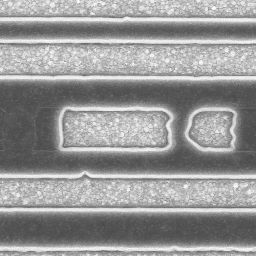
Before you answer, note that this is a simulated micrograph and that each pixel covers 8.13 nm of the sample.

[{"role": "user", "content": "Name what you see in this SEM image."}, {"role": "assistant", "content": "one or a few lines or trenches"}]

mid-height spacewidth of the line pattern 287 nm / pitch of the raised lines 540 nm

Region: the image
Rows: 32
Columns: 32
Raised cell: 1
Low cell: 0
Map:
00000000000000000000000000000000
00000000000000000000000000000000
11111111111111111111111111111100
11111111111111111111111111111111
11111111111111111111111111111111
00000000000000000000000000000000
00000000000000000000000000000000
00000000000000000000000000000000
00000000000000000000000000000000
00000000000000000000000000000000
11111111111111111111111111111111
11111111111111111111111111111111
11111111111111111111111111111111
11111111111111111111111111111111
11111111000000000000011100000111
11111111000000000000011100000111
11111111000000000000011000000111
11111111000000000000011100000111
11111111000000000000011110000111
11111111111111111111111111111111
11111111111111111111111111111111
11111111111111111111111111111111
00000000000000000000000000000000
00000000000000000000000000000000
00000000000000000000000000000000
00000000000000000000000000000000
11111111111111111111111111111111
11111111111111111111111111111111
11111111111111111111111111111111
11111111111111111111111111111111
11111111111111111111111111111111
00000000000000000000000000000000